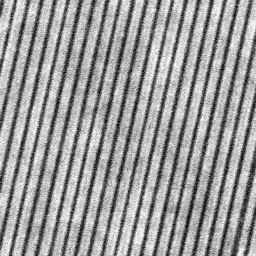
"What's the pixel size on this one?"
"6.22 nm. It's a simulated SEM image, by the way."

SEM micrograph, parallel lines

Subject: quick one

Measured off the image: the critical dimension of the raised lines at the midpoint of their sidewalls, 48.5 nanometers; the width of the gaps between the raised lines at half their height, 32.6 nanometres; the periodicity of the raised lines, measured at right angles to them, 79.4 nm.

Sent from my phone